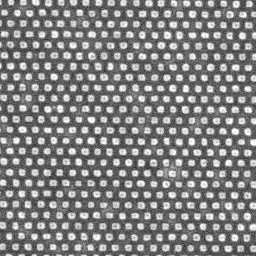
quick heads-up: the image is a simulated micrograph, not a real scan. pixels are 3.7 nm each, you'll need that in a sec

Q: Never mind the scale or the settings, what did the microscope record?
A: a regular array of raised bodies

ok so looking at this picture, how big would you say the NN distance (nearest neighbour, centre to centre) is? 44.2 nanometers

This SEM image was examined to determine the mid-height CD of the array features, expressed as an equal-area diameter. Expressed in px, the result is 5.62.